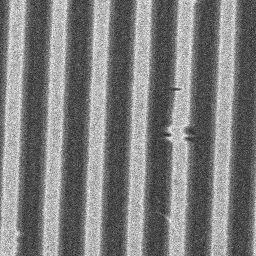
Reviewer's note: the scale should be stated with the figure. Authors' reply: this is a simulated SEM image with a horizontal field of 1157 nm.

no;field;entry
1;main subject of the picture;parallel lines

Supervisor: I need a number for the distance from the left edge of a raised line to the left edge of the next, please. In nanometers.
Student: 191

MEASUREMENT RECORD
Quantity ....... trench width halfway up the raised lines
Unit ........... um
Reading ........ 0.106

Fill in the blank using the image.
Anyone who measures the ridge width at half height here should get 18.7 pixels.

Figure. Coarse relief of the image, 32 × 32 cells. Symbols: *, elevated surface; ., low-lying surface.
.**...***...**...**...***..***..
.**...**....**...**...**...***..
.**...**....**...**...**...***..
.**...**...***...**...**...***..
.**...**...***...**...**...***..
.**...**...***...**...**...**...
.**...**...***...**...**...**...
.**...**...***...**...**...***..
.**...**...***...**...**...**...
.**...**...***...**...**...**...
.**...**...***..***...**...**...
.**...**...**...***...**...**...
.**...**...**...***...**...**...
.**...**...**...***..***...**...
***...**...**...***..***...**...
***...**...**...**...***...**...
***...**...**...**...**....**...
***...**...**...**...**....**...
***...**...**...**...***...**...
***...**...**...**...***...**...
***...**...**...**...***...**...
***..***...**...**...***...**...
***..***...**...**...***..***...
**...***...**...**...***...**...
**...***...**...**...**....**...
**...***...**...**...**...***...
**...***...**...**...**...***...
**...**....**...**...**...***...
**...**...***...**...**...***...
**...**...***...**...**...***...
**...**...***...**...**...***...
**...**...***...**...**...**...*